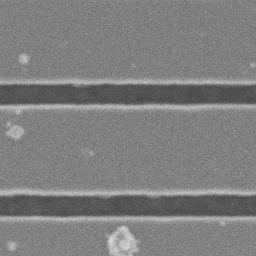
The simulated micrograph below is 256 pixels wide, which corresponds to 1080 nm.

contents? lines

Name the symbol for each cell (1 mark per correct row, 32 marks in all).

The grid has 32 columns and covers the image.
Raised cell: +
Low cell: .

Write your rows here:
++++++++++++++++++++++++++++++++
++++++++++++++++++++++++++++++++
++++++++++++++++++++++++++++++++
++++++++++++++++++++++++++++++++
++++++++++++++++++++++++++++++++
++++++++++++++++++++++++++++++++
++++++++++++++++++++++++++++++++
++++++++++++++++++++++++++++++++
++++++++++++++++++++++++++++++++
++++++++++++++++++++++++++++++++
++++++++.+++..++..++++++++++++++
................................
................................
++++++++++++++++++++++++++++++++
++++++++++++++++++++++++++++++++
++++++++++++++++++++++++++++++++
++++++++++++++++++++++++++++++++
++++++++++++++++++++++++++++++++
++++++++++++++++++++++++++++++++
++++++++++++++++++++++++++++++++
++++++++++++++++++++++++++++++++
++++++++++++++++++++++++++++++++
++++++++++++++++++++++++++++++++
++++++++++++++++++++++++++++++++
................................
................................
................................
++++++++++++++++++++++++++++++++
++++++++++++++++++++++++++++++++
++++++++++++++++++++++++++++++++
++++++++++++++++++++++++++++++++
++++++++++++++++++++++++++++++++